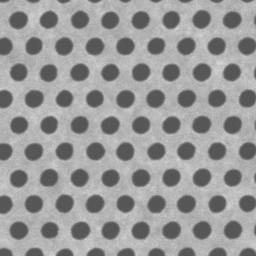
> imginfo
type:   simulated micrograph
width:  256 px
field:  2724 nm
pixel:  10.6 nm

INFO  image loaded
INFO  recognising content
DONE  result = a regular array of holes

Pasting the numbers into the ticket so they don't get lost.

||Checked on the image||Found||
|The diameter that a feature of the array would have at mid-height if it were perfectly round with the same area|197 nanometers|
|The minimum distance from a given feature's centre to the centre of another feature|320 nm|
